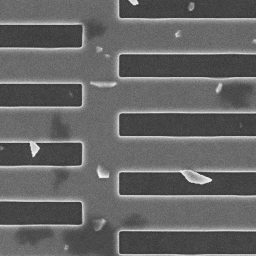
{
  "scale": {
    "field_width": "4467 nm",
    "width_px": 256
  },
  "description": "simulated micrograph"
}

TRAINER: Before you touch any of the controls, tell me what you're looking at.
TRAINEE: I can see groups of lines, slits or small figures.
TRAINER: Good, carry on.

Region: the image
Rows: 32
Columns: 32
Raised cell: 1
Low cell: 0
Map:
11111111111111100000000000000000
11111111111111100000000000000000
11111111111111111111111111111111
00000000001111111111111111111111
00000000001111111111111111111111
00000000001111111111111111111111
11111111111111111111111111111111
11111111111111100000000000000000
11111111111111100000000000000000
11111111111111100000000000000000
00000000001111111111111111111111
00000000001111111111111111111111
00000000001111111111111111111111
11111111111111111111111111111111
11111111111111100000000000000000
11111111111111100000000000000000
11111111111111100000000000000000
11111111111111111111111111111111
00001000001111111111111111111111
00000000001111111111111111111111
00000000001111111111111111111111
11111111111111100000001111000000
11111111111111100000000011000000
11111111111111100000000000000000
11111111111111111111000111111100
00000000001111111111111111111111
00000000001111111111111111111111
00000000001111111111111111111111
11111111111111111111111111111111
11111111111111100000000000000000
11111111111111100000000000000000
11111111111111100000000000000000